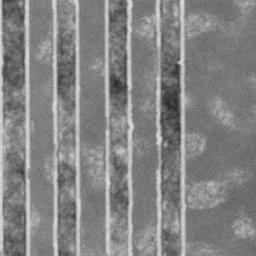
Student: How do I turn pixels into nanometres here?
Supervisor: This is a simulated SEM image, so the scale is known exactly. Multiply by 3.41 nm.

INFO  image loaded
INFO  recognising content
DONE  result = parallel lines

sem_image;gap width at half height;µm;0.0674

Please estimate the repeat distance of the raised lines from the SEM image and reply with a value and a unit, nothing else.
176 nm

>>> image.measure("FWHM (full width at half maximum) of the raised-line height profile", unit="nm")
109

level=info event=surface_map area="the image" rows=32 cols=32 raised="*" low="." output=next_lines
...****..****...****...*********
...****...***...****...*********
...****...****..****...*********
...****..****...****...*********
...****..****...****...*********
...****..*****..****...*********
...****..*****..****...*********
...****..*****..****...*********
...****..****...****...*********
...****...****..****...*********
...****..****...****...*********
...****..*****..****...*********
...****..*****..****...*********
...****..*****..****...*********
...****..*****..****...*********
...****..****...****...*********
...****..*****..****...*********
...****...****..****...*********
...****...****..****...*********
...****...****..****...*********
...****...****..****...*********
...****...****..****...*********
...****...****..****...*********
...****...****..****...*********
...****...****..****...*********
...****...****..****...*********
...****...****..****...*********
...****...****..****...*********
...****...****..****...*********
...****...****..****...*********
...****...****..****...*********
...****...****..****...*********